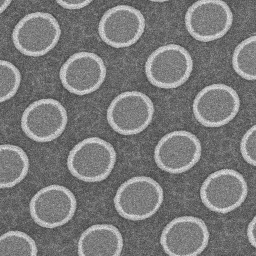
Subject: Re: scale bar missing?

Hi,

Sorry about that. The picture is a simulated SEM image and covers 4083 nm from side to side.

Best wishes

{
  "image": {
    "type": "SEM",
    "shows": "a regular array of raised bodies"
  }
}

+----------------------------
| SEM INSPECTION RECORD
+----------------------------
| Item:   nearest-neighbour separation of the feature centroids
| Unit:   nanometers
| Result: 966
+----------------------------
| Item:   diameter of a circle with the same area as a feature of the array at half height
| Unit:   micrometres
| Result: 0.65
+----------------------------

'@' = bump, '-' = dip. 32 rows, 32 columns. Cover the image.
@-------@@@--------------@@@----
--------------@@@-------@@@@@---
---@@@@------@@@@@-----@@@@@@---
--@@@@@------@@@@@------@@@@----
--@@@@@------@@@@-------@@@-----
--@@@@@-------@@--------------@@
---@@@--------------@@@-------@@
---------@@@-------@@@@@-----@@@
@@------@@@@@------@@@@@------@@
@@------@@@@@------@@@@--------@
@@------@@@@--------@@----------
@@-------@@--------------@@@@---
--------------@@@@-------@@@@@--
----@@@@------@@@@@-----@@@@@@--
---@@@@@------@@@@@------@@@@---
---@@@@@------@@@@--------@@----
---@@@@--------@@--------------@
-----@--------------@@@@-------@
@@--------@@@@------@@@@@-----@@
@@@------@@@@@------@@@@@------@
@@@------@@@@@------@@@@--------
@@@------@@@@@--------------@---
@@---------------@@-------@@@@--
------@@-------@@@@@-----@@@@@@-
----@@@@@------@@@@@-----@@@@@--
----@@@@@------@@@@@------@@@@--
----@@@@@------@@@@-------------
-----@@@--------------@@@-------
------------@@-------@@@@@-----@
@@@-------@@@@@-----@@@@@@-----@
@@@@------@@@@@-----@@@@@@------
@@@@------@@@@@------@@@@-------